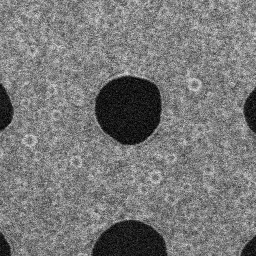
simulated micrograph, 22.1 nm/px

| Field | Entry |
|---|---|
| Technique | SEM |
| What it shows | holes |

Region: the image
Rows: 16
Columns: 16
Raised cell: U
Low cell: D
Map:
UUUUUUUUUUUUUUUU
UUUUUUUUUUUUUUUU
UUUUUUUUUUUUUUUU
UUUUUUUUUUUUUUUU
UUUUUUUUUUUUUUUU
UUUUUUDDDDUUUUUU
DUUUUUDDDDUUUUUD
DUUUUUDDDDUUUUUD
UUUUUUUDDUUUUUUU
UUUUUUUUUUUUUUUU
UUUUUUUUUUUUUUUU
UUUUUUUUUUUUUUUU
UUUUUUUUUUUUUUUU
UUUUUUUUUUUUUUUU
UUUUUUDDDDUUUUUU
DUUUUUDDDDUUUUUD